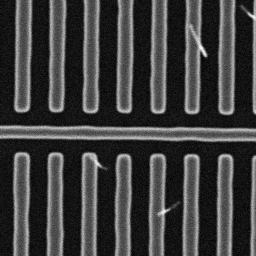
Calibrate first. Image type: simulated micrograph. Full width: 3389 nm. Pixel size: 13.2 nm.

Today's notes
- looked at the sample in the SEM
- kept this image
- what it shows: groups of lines, slits or small figures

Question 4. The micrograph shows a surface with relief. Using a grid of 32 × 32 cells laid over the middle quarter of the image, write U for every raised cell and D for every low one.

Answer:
DDDDDUUUDDDDDDUUUDDDDDUUUDDDDDDU
DDDDDUUUDDDDDDUUUDDDDDUUUDDDDDDU
DDDDDUUUDDDDDDUUUDDDDDUUUDDDDDDU
DDDDDUUUDDDDDDUUUDDDDDUUUDDDDDDU
DDDDDUUUDDDDDDUUUDDDDDUUUDDDDDDU
DDDDDUUUDDDDDDUUUDDDDDUUUDDDDDDU
DDDDDUUUDDDDDDUUUDDDDDUUUDDDDDDU
DDDDDUUUDDDDDUUUUDDDDDUUUDDDDDDU
DDDDDUUUDDDDDUUUUDDDDDUUUDDDDDDU
DDDDDUUUDDDDDDUUUDDDDDUUUDDDDDDU
DDDDDUUUDDDDDDUUUDDDDDUUUDDDDDDU
DDDDDUUUDDDDDDUUUDDDDDUUUDDDDDDU
DDDDDDDDDDDDDDDDDDDDDDDDDDDDDDDD
DDDDDDDDDDDDDDDDDDDDDDDDDDDDDDDD
DDDDDDDDDDDDDDDDDDDDDDDDDDDDDDDD
DDDDDDDDDDDDDDDDDDDDDDDDDDDDDDDD
UUUUUUUUUUUUUUUUUUUUUUUUUUUUUUUU
UUUUUUUUUUUUUUUUUUUUUUUUUUUUUUUU
DDDDDUUUUUUUUUUUUUUUUUUUUUUUUUUU
DDDDDDDDDDDDDDDDDDDDDDDDDDDDDDDD
DDDDDDDDDDDDDDDDDDDDDDDDDDDDDDDD
DDDDDDDDDDDDDDDDDDDDDDDDDDDDDDDD
DDDDDUUUDDDDDDDDDDDDDDDDDDDDDDDD
DDDDDUUUDDDDDDUUUDDDDDUUUDDDDDUU
DDDDDUUUDDDDDUUUUDDDDDUUUDDDDDUU
DDDDDUUUDDDDDUUUUDDDDDUUUDDDDDUU
DDDDDUUUDDDDDUUUUDDDDDUUUDDDDDUU
DDDDDUUUDDDDDUUUUDDDDDUUUDDDDDUU
DDDDDUUUDDDDDUUUUDDDDDUUUDDDDDUU
DDDDDUUUDDDDDUUUUDDDDDUUUDDDDDUU
DDDDDUUUDDDDDUUUUDDDDDUUUDDDDDUU
DDDDDUUUDDDDDUUUUDDDDDUUUDDDDDUU